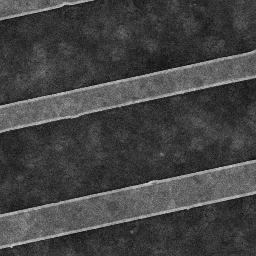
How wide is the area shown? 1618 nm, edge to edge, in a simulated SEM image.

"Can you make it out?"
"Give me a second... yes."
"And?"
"one or a few lines or trenches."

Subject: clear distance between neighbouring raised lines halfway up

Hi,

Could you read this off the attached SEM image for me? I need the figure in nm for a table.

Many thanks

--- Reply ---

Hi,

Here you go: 523